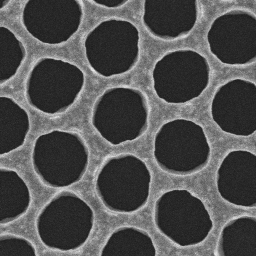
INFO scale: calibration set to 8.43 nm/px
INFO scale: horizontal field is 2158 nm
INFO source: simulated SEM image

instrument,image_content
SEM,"a regular array of holes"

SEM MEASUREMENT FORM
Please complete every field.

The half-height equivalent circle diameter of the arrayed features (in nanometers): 463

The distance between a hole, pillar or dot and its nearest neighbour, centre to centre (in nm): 576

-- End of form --